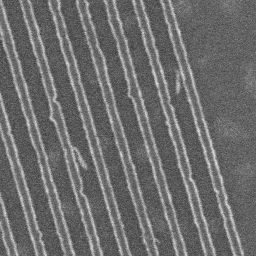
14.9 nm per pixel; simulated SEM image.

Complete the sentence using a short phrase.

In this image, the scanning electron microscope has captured parallel lines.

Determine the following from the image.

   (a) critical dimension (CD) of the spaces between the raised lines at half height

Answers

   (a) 277 nm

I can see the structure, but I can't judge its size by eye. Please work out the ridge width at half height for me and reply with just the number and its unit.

127 nanometres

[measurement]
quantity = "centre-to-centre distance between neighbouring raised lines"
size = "402 nm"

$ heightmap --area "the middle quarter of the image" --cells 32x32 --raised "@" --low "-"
-@@-----@@-----@@-----@@-----@@-
-@@-----@@@----@@-----@@-----@@@
-@@@----@@@----@@@-----@@-----@@
--@@-----@@-----@@-----@@-----@@
--@@-----@@-----@@-----@@-----@@
--@@-----@@-----@@-----@@@----@@
---@@-----@@----@@@-----@@-----@
---@@-----@@----@@@-----@@-----@
---@@-----@@-----@@-----@@-----@
---@@@----@@@----@@@----@@------
----@@-----@@-----@@-----@@-----
----@@-----@@-----@@-----@@-----
----@@@----@@-----@@@----@@-----
----@@@-----@@-----@@-----@@----
-----@@-----@@-----@@-----@@----
-----@@-----@@-----@@-----@@----
------@@----@@@----@@@----@@@---
@-----@@-----@@-----@@-----@@---
@-----@@-----@@-----@@-----@@---
@-----@@@----@@@----@@@----@@@--
@@----@@@----@@@-----@@-----@@--
@@-----@@-----@@-----@@-----@@--
@@-----@@-----@@-----@@-----@@--
@@-----@@@----@@@----@@@-----@@-
-@@-----@@-----@@-----@@-----@@-
-@@-----@@-----@@-----@@-----@@-
-@@@----@@@----@@@----@@-----@@@
-@@@----@@@-----@@-----@@-----@@
--@@-----@@-----@@-----@@-----@@
--@@-----@@-----@@-----@@-----@@
--@@-----@@@----@@@----@@@-----@
---@------@@----@@@-----@@-----@